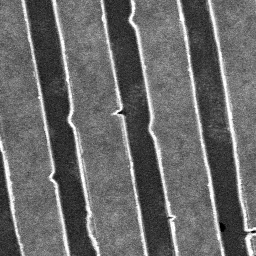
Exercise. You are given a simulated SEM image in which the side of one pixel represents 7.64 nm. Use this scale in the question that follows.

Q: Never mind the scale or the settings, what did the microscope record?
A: one or a few lines or trenches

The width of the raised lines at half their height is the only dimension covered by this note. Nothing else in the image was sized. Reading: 362 nanometers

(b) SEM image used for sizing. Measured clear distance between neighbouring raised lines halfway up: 219 nm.